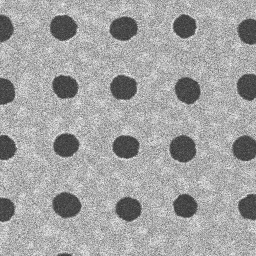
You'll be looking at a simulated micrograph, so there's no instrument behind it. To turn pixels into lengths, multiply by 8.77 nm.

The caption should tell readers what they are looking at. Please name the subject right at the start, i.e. a regular array of holes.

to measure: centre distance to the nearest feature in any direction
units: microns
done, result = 0.511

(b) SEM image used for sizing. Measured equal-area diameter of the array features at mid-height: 0.228 µm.